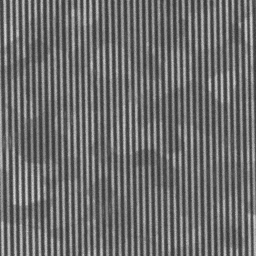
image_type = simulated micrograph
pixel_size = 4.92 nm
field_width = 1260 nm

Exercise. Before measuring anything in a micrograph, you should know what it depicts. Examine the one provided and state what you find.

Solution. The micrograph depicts parallel lines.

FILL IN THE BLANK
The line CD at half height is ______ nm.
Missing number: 8.6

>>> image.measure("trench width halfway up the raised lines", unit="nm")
22.1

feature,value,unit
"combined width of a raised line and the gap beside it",30.3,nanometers